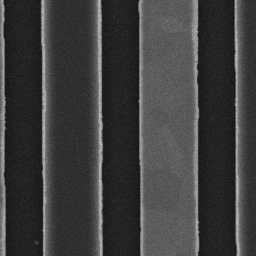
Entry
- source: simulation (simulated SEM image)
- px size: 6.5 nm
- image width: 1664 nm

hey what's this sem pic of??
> lines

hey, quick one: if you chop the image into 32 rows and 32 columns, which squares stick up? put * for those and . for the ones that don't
.....********....********....***
.....********....********.....**
.....********....********.....**
.....********....********.....**
.....********....********.....**
.....********....********.....**
.....********....********.....**
.....********....********.....**
.....********....********.....**
.....********....********.....**
.....********....********.....**
.....********....********.....**
.....********....********.....**
.....********....********.....**
.....********....********.....**
.....********....********.....**
.....********....********.....**
.....********....********.....**
.....********.....*******.....**
.....********....********.....**
.....********.....*******.....**
.....********.....*******.....**
.....********.....*******.....**
.....********.....*******.....**
*....********.....*******.....**
*....********.....*******.....**
*....********.....*******.....**
*....********.....*******.....**
*....********.....*******.....**
*....********.....*******.....**
*....********.....*******.....**
*....********.....*******.....**